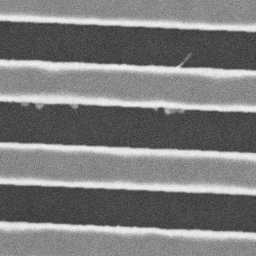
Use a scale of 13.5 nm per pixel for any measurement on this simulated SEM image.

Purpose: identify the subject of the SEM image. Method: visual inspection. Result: lines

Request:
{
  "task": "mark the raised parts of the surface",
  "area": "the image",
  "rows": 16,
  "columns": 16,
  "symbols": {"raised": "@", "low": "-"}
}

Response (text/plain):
@@@@@@@@@@@@@@@@
------@@@@@@@@@@
----------------
----------------
@@@@@@@@@@@@@@@@
@@@@@@@@@@@@@@@@
-----@@@@@@@@@@@
----------------
----------------
@@@@@@@@@@@@@---
@@@@@@@@@@@@@@@@
-@@@@@@@@@@@@@@@
----------------
----------------
@@@@@@@@@@@@@@@-
@@@@@@@@@@@@@@@@